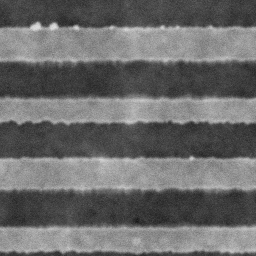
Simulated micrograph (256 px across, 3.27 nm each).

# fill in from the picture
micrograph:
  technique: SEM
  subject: lines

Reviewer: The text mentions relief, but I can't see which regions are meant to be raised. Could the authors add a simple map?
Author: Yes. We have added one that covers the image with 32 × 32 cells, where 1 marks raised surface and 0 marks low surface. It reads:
00000000000000000000000000000000
00000000000000000000000000000000
00000000000000000000000000000000
00011111110001100100111110100101
11111111111111111111111111111111
11111111111111111111111111111111
11111111111111111111111111111111
11111111111111111011111111110111
00000000000000000000000000000000
00000000000000000000000000000000
00000000000000000000000000000000
00000000000000000000000000000000
11111111111111111111111111111111
11111111111111111111111111111111
11111111111111111111111111111111
00000000000000000000000000000000
00000000000000000000000000000000
00000000000000000000000000000000
00000000000000000000000000000000
00000000000000000000000000000000
11111111111111111111111111111111
11111111111111111111111111111111
11111111111111111111111111111111
11111111111111111111111111111111
00000000000000000000000000000000
00000000000000000000000000000000
00000000000000000000000000000000
00000000000000000000000000000000
10100011111111111111111111111111
11111111111111111111111111111111
11111111111111111111111111111111
10110000000000011110101100000111